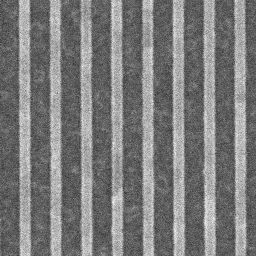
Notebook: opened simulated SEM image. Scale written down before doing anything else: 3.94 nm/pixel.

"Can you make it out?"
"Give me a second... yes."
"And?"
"parallel lines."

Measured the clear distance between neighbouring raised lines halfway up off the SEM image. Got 86.1 nm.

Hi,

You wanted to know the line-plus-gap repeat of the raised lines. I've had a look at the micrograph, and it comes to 0.121 microns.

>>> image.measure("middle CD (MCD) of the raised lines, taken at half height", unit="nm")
36.4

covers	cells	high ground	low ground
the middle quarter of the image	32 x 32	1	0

00001110000011000000110000001100
00001110000011000000110000001100
00001110000011000000110000001100
00001110000011000000110000001100
00001110000011000000110000001100
00001110000011000000110000001100
00001110000011000000110000001100
00001110000011000000110000001100
00001110000011000000110000001100
00001110000011000000110000001100
00001110000011000000110000001100
00001110000011000000110000001100
00001110000011000000110000001100
00001110000011000000110000001100
00001110000011000000110000001100
00000110000011000000110000001100
00001110000011000000110000001100
00000110000011000000110000001100
00000110000011000000110000001100
00000110000011000000110000001100
00000110000011000000110000001100
00000110000011000000110000001100
00000110000011000000110000001100
00000110000011000000110000001100
00000110000011000000110000001100
00000110000011000000110000001100
00000110000011000000110000001100
00000110000011000000110000001100
00000110000011000000110000001100
00000110000011000000110000001100
00000110000011000000110000001100
00000110000011000000110000001100